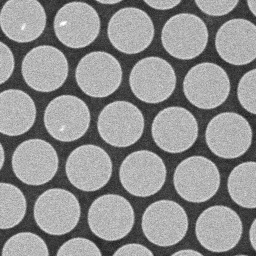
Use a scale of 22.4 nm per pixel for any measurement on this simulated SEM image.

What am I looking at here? an array of small figures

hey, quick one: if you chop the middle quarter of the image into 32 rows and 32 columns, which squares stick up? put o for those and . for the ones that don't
o..ooooooooooo....ooooooooo.....
o..ooooooooooo...oooooooooo.....
o..ooooooooooo...ooooooooooo...o
...ooooooooooo...ooooooooooo..oo
...ooooooooooo..oooooooooooo..oo
....oooooooooo...ooooooooooo..oo
.....oooooooo....oooooooooo...oo
......ooooo.......ooooooooo...oo
ooo................ooooooo.....o
ooooo........oo......ooo........
oooooo.....oooooo...............
oooooo....ooooooooo......oooooo.
oooooo...oooooooooo.....oooooooo
oooooo...ooooooooooo...ooooooooo
oooooo...ooooooooooo..oooooooooo
oooooo...ooooooooooo..oooooooooo
oooooo...ooooooooooo..oooooooooo
ooooo....oooooooooo...oooooooooo
oooo......ooooooooo...oooooooooo
...........ooooooo.....ooooooooo
.....ooo.....ooo........oooooooo
...ooooooo...............ooooo..
..ooooooooo......oooooo.........
.oooooooooo.....oooooooo.......o
.ooooooooooo...oooooooooo....ooo
.ooooooooooo..ooooooooooo....ooo
.ooooooooooo..ooooooooooo...oooo
.ooooooooooo..ooooooooooo...oooo
.oooooooooo...ooooooooooo...oooo
..ooooooooo...ooooooooooo...oooo
...ooooooo.....ooooooooo....oooo
.....ooo........oooooooo....oooo